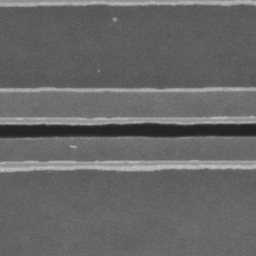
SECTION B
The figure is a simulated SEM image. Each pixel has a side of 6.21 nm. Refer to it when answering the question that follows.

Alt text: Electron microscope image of lines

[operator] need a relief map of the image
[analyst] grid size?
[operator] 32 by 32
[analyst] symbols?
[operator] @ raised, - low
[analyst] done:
@@@@@---------@@@---------------
--------------------------------
--------------------------------
--------------------------------
--------------------------------
--------------------------------
--------------------------------
--------------------------------
--------------------------------
--------------------------------
--------------------------------
@@@@@@@@@@@@@@@@@@@@@@@@@@@@@@@@
@@@@@@@@@@@@@@@@@@@@@@@@@@@@@@@@
@@@@@@@@@@@@@@@@@@@@@@@@@@@@@@@@
@@@@@@@@@@@@@@@@@@@@@@@@@@@@@@@@
@@@@@@@@@@@@@@--------@@@-------
--------------------------------
@@@@@@@@@@@@@@@@@@@@@@@@@@@@@@@@
@@@@@@@@@@@@@@@@@@@@@@@@@@@@@@@@
@@@@@@@@@@@@@@@@@@@@@@@@@@@@@@@@
@@@@@@@@@@@@@@@@@@@@@@@@@@@@@@@@
--------------------------------
--------------------------------
--------------------------------
--------------------------------
--------------------------------
--------------------------------
--------------------------------
--------------------------------
--------------------------------
--------------------------------
--------------------------------